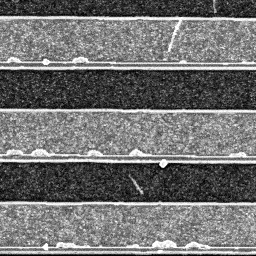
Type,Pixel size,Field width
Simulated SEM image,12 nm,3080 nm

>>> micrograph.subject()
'lines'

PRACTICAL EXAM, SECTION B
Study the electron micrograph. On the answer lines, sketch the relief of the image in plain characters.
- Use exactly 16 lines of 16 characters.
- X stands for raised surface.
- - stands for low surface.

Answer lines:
----------------
XXXXXXXXXXXXXXXX
XXXXXXXXXXXXXXXX
XXXXXXXXXXXXXXXX
----------------
----------------
----------------
XXXXXXXXXXXXXXXX
XXXXXXXXXXXXXXXX
XXXXXXXXXXXXXXXX
----------------
----------------
----------------
XXXXXXXXXXXXXXXX
XXXXXXXXXXXXXXXX
XXXXXXXXXXXXXXXX